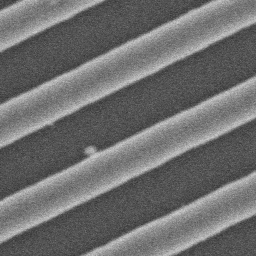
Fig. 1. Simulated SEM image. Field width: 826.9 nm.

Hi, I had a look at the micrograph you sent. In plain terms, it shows lines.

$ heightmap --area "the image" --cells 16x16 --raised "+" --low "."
+++++.......++++
+++.......++++++
+.......++++++..
......++++++....
....++++++......
..++++++.......+
+++++.......++++
++++......++++++
+.......++++++..
......+++++.....
....++++++......
..++++++......++
+++++.......++++
+++.......++++++
+.......++++++..
......++++++....